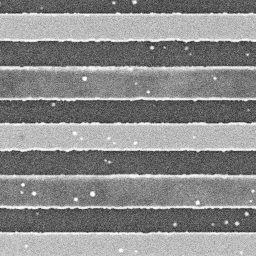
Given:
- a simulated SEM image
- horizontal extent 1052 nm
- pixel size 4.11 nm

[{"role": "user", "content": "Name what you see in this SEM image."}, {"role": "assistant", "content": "lines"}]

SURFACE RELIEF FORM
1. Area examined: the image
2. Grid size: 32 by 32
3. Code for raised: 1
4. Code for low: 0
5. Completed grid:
00000000000000000000000000000000
00000000000000000000000000000000
11111111111111111111111111111111
11111111111111111111111111111111
11111111111111111111111111111111
00000000000000000000000000000000
00000000000000000000000000000000
00000000000000000000000000000000
11111110011111100000000011111111
11111111111111111111111111111111
11111111111111111111111111111111
11111111111111111111111111111111
00000001110000001000000010000010
00000000000000000000000000000000
00000000000000000000000000000000
00000101001110110110000111001111
11111111111111111111111111111111
11111111111111111111111111111111
11111111111111111111111111111111
00000000000000000000000000000000
00000000000000000000000000000000
00000000000000000000000000000000
11111111111111111111111111111111
11111111111111111111111111111111
11111111111111111111111111111111
11111111111111111111111111111111
00000000000000000000000000000000
00000000000000000000000000000000
00000000000000000000000000000000
11111111111111111111111111111111
11111111111111111111111111111111
11111111111111111111111111111111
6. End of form